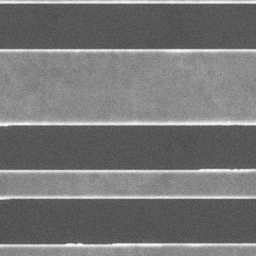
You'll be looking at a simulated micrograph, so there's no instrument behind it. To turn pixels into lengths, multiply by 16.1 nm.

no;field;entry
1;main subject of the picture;lines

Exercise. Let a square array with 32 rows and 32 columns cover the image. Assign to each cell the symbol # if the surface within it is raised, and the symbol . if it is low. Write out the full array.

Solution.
................................
................................
................................
................................
................................
................................
################################
################################
################################
################################
################################
################################
################################
################################
################################
###########################.#...
................................
................................
................................
................................
................................
################################
################################
################################
################################
................................
................................
................................
................................
................................
................................
################################